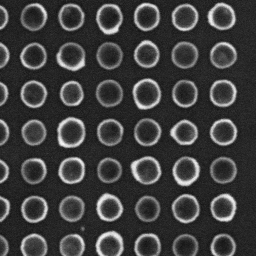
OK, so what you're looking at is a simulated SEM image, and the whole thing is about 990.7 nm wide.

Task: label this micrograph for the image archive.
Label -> a regular array of raised bodies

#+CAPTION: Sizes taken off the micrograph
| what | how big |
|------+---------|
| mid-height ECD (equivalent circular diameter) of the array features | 100 nanometers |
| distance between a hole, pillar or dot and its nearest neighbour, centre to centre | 37.2 pixels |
